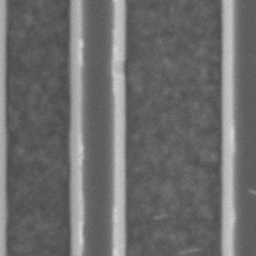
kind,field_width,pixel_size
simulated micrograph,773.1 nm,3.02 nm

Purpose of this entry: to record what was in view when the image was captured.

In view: one or a few lines or trenches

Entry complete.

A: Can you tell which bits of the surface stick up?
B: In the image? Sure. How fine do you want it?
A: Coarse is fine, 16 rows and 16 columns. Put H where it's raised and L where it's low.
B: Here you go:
LLLLLHHLLLLLLLHH
LLLLLHHLLLLLLLHH
LLLLLHHLLLLLLLHH
LLLLLHHHLLLLLLHH
LLLLLHHLLLLLLLHH
LLLLLHHHLLLLLLHH
LLLLLHHHLLLLLLHH
LLLLLHHHLLLLLLHH
LLLLLHHHLLLLLLHH
LLLLLHHHLLLLLLHH
LLLLLHHLLLLLLLHH
LLLLLHHLLLLLLLHH
LLLLLHHLLLLLLLHH
LLLLLHHLLLLLLLHH
LLLLLHHLLLLLLLHH
LLLLLHHLLLLLLLHH